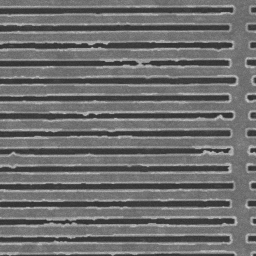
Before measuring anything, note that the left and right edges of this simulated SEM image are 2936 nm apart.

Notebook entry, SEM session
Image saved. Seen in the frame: parallel lines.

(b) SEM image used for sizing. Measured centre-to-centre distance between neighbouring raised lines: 202 nm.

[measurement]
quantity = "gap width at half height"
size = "78.9 nm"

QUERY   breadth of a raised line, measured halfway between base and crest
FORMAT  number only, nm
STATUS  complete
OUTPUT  125